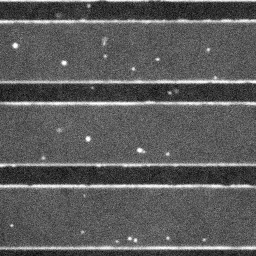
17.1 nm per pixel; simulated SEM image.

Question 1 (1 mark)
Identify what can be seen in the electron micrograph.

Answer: lines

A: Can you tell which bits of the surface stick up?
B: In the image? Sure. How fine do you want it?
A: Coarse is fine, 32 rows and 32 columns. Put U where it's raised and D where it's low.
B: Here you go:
DDDDDDDDDDDDDDDDDDDDDDDDDDDDDDDD
DDDDDDDDDDDDDDDDDDDDDDDDDDDDDDDD
DDDDDDDDDDDDDDDDDDDDDDDDDDDDDDDD
UUUUUUUUUUUUUUUUUUUUUUUUUUUUUUUU
UUUUUUUUUUUUUUUUUUUUUUUUUUUUUUUU
UUUUUUUUUUUUUUUUUUUUUUUUUUUUUUUU
UUUUUUUUUUUUUUUUUUUUUUUUUUUUUUUU
UUUUUUUUUUUUUUUUUUUUUUUUUUUUUUUU
UUUUUUUUUUUUUUUUUUUUUUUUUUUUUUUU
UUUUUUUUUUUUUUUUUUUUUUUUUUUUUUUU
DDDDDDDDDDDDDDDDDDDDDDDDDDDDDDDD
DDDDDDDDDDDDDDDDDDDDDDDDDDDDDDDD
DDDDDDDDDDDDDDDDDDDDDDDDDDDDDDDD
UUUUUUUUUUUUUUUUUUUUUUUUUUUUUUUU
UUUUUUUUUUUUUUUUUUUUUUUUUUUUUUUU
UUUUUUUUUUUUUUUUUUUUUUUUUUUUUUUU
UUUUUUUUUUUUUUUUUUUUUUUUUUUUUUUU
UUUUUUUUUUUUUUUUUUUUUUUUUUUUUUUU
UUUUUUUUUUUUUUUUUUUUUUUUUUUUUUUU
UUUUUUUUUUUUUUUUUUUUUUUUUUUUUUUU
UUUUUUUUUUUUUUUUUUUUUUUUUUUUUUUU
DDDDDDDDDDDDDDDDDDDDDDDDDDDDDDDD
DDDDDDDDDDDDDDDDDDDDDDDDDDDDDDDD
UUUUUUUUUUUUUUUUUUUUUUUUUUUUUUUU
UUUUUUUUUUUUUUUUUUUUUUUUUUUUUUUU
UUUUUUUUUUUUUUUUUUUUUUUUUUUUUUUU
UUUUUUUUUUUUUUUUUUUUUUUUUUUUUUUU
UUUUUUUUUUUUUUUUUUUUUUUUUUUUUUUU
UUUUUUUUUUUUUUUUUUUUUUUUUUUUUUUU
UUUUUUUUUUUUUUUUUUUUUUUUUUUUUUUU
UUUUUUUUUUUUUUUUUUUUUUUUUUUUUUUU
DDDDDDDDDDDDDDDDDDDDDDDDDDDDDDDD